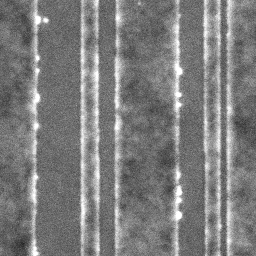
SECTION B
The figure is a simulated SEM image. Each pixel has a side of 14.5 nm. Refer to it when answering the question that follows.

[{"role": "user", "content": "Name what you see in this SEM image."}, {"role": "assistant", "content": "lines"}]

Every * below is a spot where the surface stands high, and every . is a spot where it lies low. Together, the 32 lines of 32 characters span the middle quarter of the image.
.....***.....****************...
.....***.....****************...
.....***.....****************...
.....***.....****************...
.....***.....***************....
.....***.....***************....
.....***.....***************....
.....***.....****************...
.....***.....***************....
.....***.....****************...
.....***.....****************...
.....***.....****************...
.....***.....****************...
.....***.....****************...
.....***.....****************...
.....***.....****************...
.....****....****************...
.....****....****************...
.....****....****************...
.....****....****************...
.....***.....***************....
.....***.....***************....
.....***.....****************...
.....****....****************...
.....****....****************...
.....****....****************...
.....****....***************....
.....****....****************...
.....****....****************...
.....****....****************...
.....****....****************...
.....****....****************...